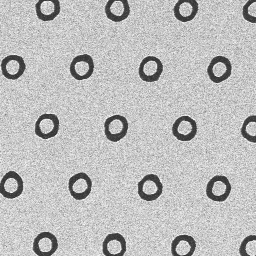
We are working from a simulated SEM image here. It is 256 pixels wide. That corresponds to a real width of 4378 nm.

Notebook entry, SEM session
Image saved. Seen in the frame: a regular array of ring-shaped grooves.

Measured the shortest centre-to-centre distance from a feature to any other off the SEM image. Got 1160 nm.